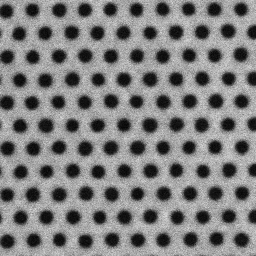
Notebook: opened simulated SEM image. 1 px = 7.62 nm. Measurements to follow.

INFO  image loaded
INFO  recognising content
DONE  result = a regular array of holes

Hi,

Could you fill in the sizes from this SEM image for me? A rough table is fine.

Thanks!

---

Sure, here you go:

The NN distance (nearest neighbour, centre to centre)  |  195 nanometers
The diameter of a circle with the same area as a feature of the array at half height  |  13.4 px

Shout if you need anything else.